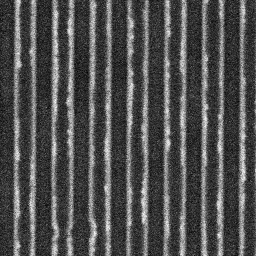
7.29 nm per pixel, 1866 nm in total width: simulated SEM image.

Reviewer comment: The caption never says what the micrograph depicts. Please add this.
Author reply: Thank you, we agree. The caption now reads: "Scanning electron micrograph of parallel lines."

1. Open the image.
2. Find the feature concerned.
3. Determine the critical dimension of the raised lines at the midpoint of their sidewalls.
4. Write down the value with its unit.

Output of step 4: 138 nanometers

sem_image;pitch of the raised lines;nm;274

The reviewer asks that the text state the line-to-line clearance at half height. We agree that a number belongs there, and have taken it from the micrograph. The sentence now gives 132 nanometers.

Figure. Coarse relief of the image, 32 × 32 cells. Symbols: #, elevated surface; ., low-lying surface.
..##...##...##..##...##...##..##
..##...##...##..##...##...##..##
..##...##...##..##...##...##..##
..##...##..###..##...##...##..##
..##...##..###..##...##...##..##
..##...##..###..##...##..###..##
..##...##..###..##...##..###..##
..##...##..###..##...##..###..##
..##...##..###..##...##..###..##
..##...##..###..##...##..###..##
..##...##..###..##...##..###..##
..##...##..###..##...##..###..##
..##...##..###..##...##..###..##
..##...##..###..##...##..###..##
..##...##..###..##...##..###..##
..##...##..###..##...##..###..##
..##...##..###..##...##..###..##
..##...##..###..##...##..###..##
..##...##..###..##...##..###..##
..##...##..###..##...##..###..##
..##...##..###..##...##..###..##
..##...##..###..##...##..###..##
..##...##..###..##...##..###..##
..##...##..###..##...##..###..##
..##...##..###..##...##..###..##
..##...##..###..##...##..###..##
..##...##..###..##...##..###..##
..##...##..###..##...##..###..##
..##...##...##..##...##..###..##
..##...##..###..##...##..###..##
..##...##..###..##...##..###..##
..##...##..###..##...##..###..##